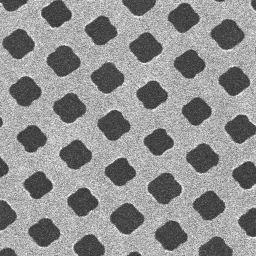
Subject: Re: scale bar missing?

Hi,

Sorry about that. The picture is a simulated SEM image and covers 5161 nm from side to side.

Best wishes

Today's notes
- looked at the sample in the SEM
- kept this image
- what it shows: a regular array of holes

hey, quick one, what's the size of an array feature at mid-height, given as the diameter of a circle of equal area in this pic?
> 0.584 microns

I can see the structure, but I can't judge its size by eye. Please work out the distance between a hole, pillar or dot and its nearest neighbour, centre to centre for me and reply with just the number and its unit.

0.951 µm